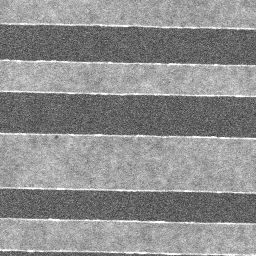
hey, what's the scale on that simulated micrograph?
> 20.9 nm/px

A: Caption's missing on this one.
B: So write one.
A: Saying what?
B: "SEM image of one or a few lines or trenches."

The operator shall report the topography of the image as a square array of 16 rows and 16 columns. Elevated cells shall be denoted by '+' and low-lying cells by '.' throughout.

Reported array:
................
++..............
++++++++++++++++
++++++++++++++++
................
................
++++++++++++++++
++++++++++++++++
........++++++++
................
................
................
++++++++++++++++
++++++++++++++++
................
................